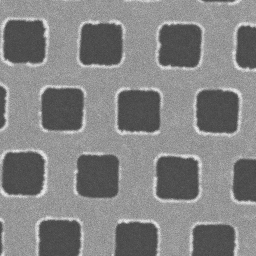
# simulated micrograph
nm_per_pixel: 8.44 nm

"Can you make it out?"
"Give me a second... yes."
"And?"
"a regular array of holes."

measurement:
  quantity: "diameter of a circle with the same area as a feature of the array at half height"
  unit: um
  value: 0.395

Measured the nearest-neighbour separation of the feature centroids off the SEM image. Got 640 nm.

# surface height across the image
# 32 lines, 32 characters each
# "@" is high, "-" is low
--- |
@@@@@@@@@@@@@@@@@@@@@@@@@@@@@@@@
@@@@@@@@@@@@@@@@@@@@@@@@@@@@@@@@
@@@@@@@@@@@@@@@@@@@@@@@@@@@@@@@@
@-----@@@@-----@@@@@-----@@@@@--
------@@@@-----@@@@@-----@@@@@--
------@@@@-----@@@@@-----@@@@@--
------@@@@-----@@@@@-----@@@@@--
@----@@@@@-----@@@@@-----@@@@@--
@@@@@@@@@@@@@@@@@@@@@@@@@@@@@@--
@@@@@@@@@@@@@@@@@@@@@@@@@@@@@@@@
@@@@@@@@@@@@@@@@@@@@@@@@@@@@@@@@
-@@@@-----@@@@@-----@@@@@----@@@
-@@@@------@@@@-----@@@@@-----@@
-@@@@-----@@@@@-----@@@@@-----@@
-@@@@-----@@@@@-----@@@@@-----@@
-@@@@-----@@@@@-----@@@@@-----@@
@@@@@@@@@@@@@@@@@@-@@@@@@@---@@@
@@@@@@@@@@@@@@@@@@@@@@@@@@@@@@@@
@@@@@@@@@@@@@@@@@@@@@@@@@@@@@@@@
@----@@@@@----@@@@@@@@@@@@@@@@@@
------@@@@-----@@@@@-----@@@@---
------@@@@-----@@@@------@@@@---
-----@@@@@-----@@@@@-----@@@@---
-----@@@@@-----@@@@------@@@@---
@@@@@@@@@@----@@@@@@-----@@@@---
@@@@@@@@@@@@@@@@@@@@@@@@@@@@@@@@
@@@@@@@@@@@@@@@@@@@@@@@@@@@@@@@@
@@@@@@-@@@@@@@@@@@@@@@@@@@@@@@@@
@@@@@-----@@@@@-----@@@@-----@@@
@@@@@-----@@@@------@@@@-----@@@
@@@@@-----@@@@------@@@@-----@@@
@@@@@-----@@@@------@@@@-----@@@